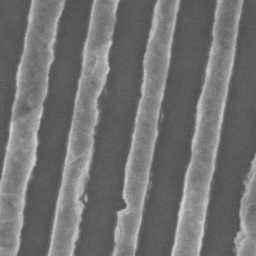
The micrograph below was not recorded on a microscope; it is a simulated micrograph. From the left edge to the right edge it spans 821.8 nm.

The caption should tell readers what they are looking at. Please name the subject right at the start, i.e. one or a few lines or trenches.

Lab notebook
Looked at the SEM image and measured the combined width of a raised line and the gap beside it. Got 0.195 microns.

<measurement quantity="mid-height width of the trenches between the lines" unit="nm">118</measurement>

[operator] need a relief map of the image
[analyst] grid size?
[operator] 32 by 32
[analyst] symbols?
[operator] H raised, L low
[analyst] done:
LLLLHHHHLLLLHHHLLLLLHHLLLLLHHHLL
LLLLHHHHLLLLHHLLLLLHHHLLLLLHHHLL
LLLLHHHLLLLHHHLLLLLHHHLLLLLHHHLL
LLLLHHHLLLLHHHLLLLLHHHLLLLLHHHLL
LLLHHHHLLLLHHHLLLLLHHLLLLLLHHLLL
LLLHHHHLLLLHHHLLLLLHHLLLLLLHHLLL
LLLHHHHLLLLHHHLLLLHHHLLLLLHHHLLL
LLLHHHHLLLHHHLLLLLHHHLLLLLHHHLLL
LLHHHHLLLLHHHHLLLLHHHLLLLLHHHLLL
LLHHHHLLLLHHHLLLLLHHHLLLLLHHHLLL
LLHHHHLLLLHHHLLLLLHHHLLLLLHHHLLL
LLHHHHLLLLHHHLLLLLHHLLLLLHHHLLLL
LLHHHLLLLHHHLLLLLLHHLLLLLHHHLLLL
LLHHHLLLLHHHLLLLLHHHLLLLLHHHLLLL
LLHHHLLLLHHHLLLLLHHHLLLLLHHHLLLL
LHHHHLLLLHHHLLLLLHHHLLLLLHHHLLLL
LHHHHLLLLHHHLLLLLHHHLLLLHHHHLLLL
LHHHLLLLLHHHLLLLLHHLLLLLHHHLLLLL
LHHHLLLLLHHHLLLLHHHLLLLLHHHLLLLL
LHHHLLLLHHHLLLLLHHHLLLLLHHHLLLLL
LHHHLLLLHHHLLLLLHHHLLLLLHHHLLLLL
HHHHLLLLHHHLLLLLHHHLLLLHHHHLLLLL
HHHHLLLLHHLLLLLLHHHLLLLHHHLLLLLH
HHHLLLLLHHLLLLLHHHLLLLLHHHLLLLLH
HHHLLLLHHHLLLLLHHHLLLLLHHHLLLLLH
HHHLLLLHHHLLLLLLHHLLLLLHHHLLLLHH
HHHLLLLHHHLLLLLHHHLLLLLHHHLLLLHH
HHHLLLLHHHLLLLLHHHLLLLHHHHLLLLHH
HHHLLLLHHHLLLLLHHLLLLLHHHLLLLLHH
HHLLLLLHHLLLLLHHHLLLLLHHHLLLLLHH
HHLLLLHHHLLLLLHHHLLLLLHHHLLLLLHH
HHLLLLHHHLLLLLHHHLLLLLHHHLLLLLHH